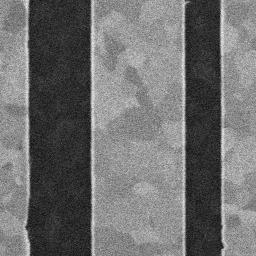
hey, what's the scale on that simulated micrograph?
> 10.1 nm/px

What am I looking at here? one or a few lines or trenches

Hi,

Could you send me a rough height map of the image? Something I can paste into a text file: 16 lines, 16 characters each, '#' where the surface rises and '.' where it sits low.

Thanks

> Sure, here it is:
##....######..##
##....#####...##
##....#####...##
##....#####...##
##....#####...##
##....#####...##
##....#####...##
##....#####...##
##....#####...##
##....#####...##
##....#####...##
##....#####...##
##....#####...##
##....#####...##
##....#####...##
##....######..##